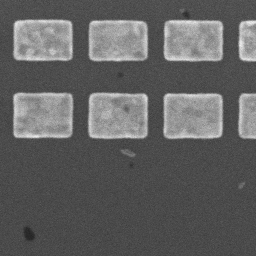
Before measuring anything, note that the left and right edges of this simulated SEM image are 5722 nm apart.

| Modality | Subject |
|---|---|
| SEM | wiring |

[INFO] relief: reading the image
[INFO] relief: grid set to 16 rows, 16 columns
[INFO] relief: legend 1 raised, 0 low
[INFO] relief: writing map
0000000000000000
0111001110011001
0111001110111101
0111001110011101
0000000000000000
0000000000000000
0111001110111101
0111001110111101
0111001110011001
0000000000000000
0000000000000000
0000000000000000
0000000000000000
0000000000000000
0000000000000000
0000000000000000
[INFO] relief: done